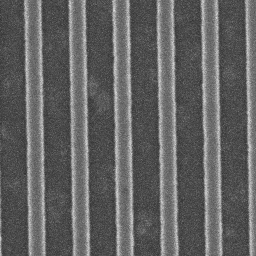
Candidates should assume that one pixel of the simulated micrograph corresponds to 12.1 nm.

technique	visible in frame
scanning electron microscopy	parallel lines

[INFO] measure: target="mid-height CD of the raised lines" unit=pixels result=15.8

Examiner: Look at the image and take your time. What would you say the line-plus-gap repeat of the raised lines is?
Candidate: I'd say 535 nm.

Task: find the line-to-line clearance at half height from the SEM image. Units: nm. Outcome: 347